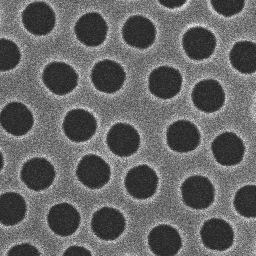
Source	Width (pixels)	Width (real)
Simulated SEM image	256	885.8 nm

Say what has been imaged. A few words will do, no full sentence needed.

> a regular array of holes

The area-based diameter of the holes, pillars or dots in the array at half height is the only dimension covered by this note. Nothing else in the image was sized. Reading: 114 nm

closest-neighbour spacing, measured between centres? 160 nanometers